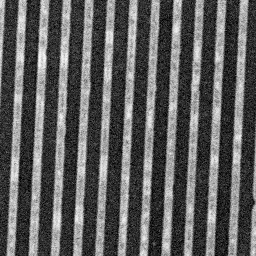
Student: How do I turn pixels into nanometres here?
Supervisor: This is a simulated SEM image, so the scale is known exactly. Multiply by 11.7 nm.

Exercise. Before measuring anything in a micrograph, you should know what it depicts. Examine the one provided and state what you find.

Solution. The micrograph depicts parallel lines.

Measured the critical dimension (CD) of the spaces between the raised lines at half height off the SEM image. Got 173 nanometres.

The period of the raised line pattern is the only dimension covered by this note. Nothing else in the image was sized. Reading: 259 nanometres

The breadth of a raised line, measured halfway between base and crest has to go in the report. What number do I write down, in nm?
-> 90.8